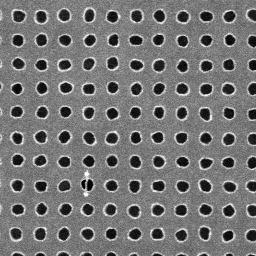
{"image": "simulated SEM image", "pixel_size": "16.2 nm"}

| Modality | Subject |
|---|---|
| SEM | a regular array of holes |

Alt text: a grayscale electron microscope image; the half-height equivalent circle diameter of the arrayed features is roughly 189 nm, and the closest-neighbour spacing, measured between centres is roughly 372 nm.